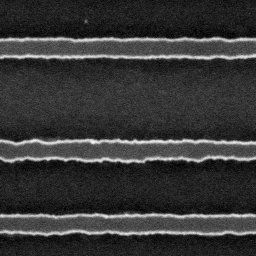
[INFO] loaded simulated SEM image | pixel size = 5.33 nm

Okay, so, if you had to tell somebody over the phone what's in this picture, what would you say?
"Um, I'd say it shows lines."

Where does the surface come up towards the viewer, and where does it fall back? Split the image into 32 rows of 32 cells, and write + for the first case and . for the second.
................................
................................
................................
................................
................................
++++++++++++++++++++++++++++++++
++++++++++++++++++++++++++++++++
................................
................................
................................
................................
................................
................................
................................
................................
................................
................................
....+...........................
++++++++++++++++++++++++++++++++
++++++++++++++++++++++++++++++++
................................
................................
................................
................................
................................
................................
................................
++++++++++++++++++++++++++++++++
++++++++++++++++++++++++++++++++
................................
................................
................................